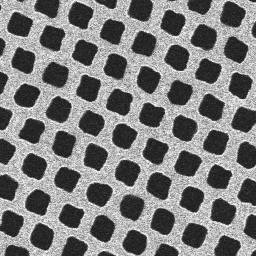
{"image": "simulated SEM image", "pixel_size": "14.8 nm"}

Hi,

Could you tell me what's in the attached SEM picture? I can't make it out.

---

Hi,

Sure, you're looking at a regular array of holes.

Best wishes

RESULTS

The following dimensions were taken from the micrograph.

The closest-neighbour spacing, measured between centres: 507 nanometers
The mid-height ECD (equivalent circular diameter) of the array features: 366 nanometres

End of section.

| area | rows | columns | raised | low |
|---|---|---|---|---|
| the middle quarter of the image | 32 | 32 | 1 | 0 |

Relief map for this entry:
11111111110000001111011111000001
01111111110000011110000111110011
01111111110000011110000011111111
01110000111110011100000011111111
11110000011111111100000011100011
11110000011111111100000111100000
11100000011100111111000111000000
11100000111100000111101111000000
11110000111000000111111111000000
01111101111000000111111111000001
00111111110000001111000111111111
00111111111000001110000001111111
00111000111111001110000001111111
01110000001111111110000001110001
11110000001111111110000011100000
11110000001110001111100011100000
11110000011100000011111111100000
01111100011100000011111111100000
00011111111100000011101111110000
00011111111100000111000001111111
00011100011110000111000000111111
00111000001111111111000000111111
00111000000111111111000000111000
01111000000111111111000001110000
11111000001111000111110001110000
11111100001110000001111111110000
00111111011110000001111111110000
00001111111110000001110001111000
00001111111110000011100000111111
00011111111111000011100000011111
00011100000011110111100000011111
00111100000011111111100000111100